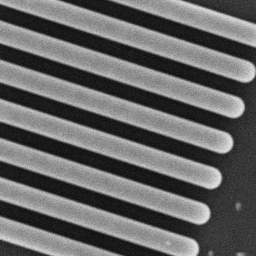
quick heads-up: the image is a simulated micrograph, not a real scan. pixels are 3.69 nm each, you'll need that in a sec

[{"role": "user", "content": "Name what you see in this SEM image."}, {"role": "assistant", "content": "groups of lines, slits or small figures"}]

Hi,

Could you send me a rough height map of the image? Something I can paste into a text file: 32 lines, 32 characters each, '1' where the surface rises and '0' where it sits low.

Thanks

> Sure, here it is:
11111111100000011111111100000000
00011111111100000011111111100000
00000011111111100000001111111100
11100000011111111100000001111111
11111100000001111111100000001111
01111111100000001111111100000001
00001111111100000001111111100000
00000001111111100000001111111100
11100000001111111100000001111111
11111100000001111111100000001111
01111111100000001111111100000000
00001111111100000001111111110000
00000001111111100000001111111100
11100000001111111110000001111100
11111110000001111111110000001100
01111111110000001111111110000000
00001111111110000001111111110000
10000001111111110000001111111000
11110000001111111110000000111000
11111110000001111111110000000000
01111111110000000111111110000000
00000111111110000000111111100000
10000000111111110000000111110000
11110000000111111110000000000000
11111110000000111111110000000000
00111111110000000111111110000000
00000111111110000000111111000000
10000000111111110000000111000000
11110000000111111111000000000000
11111111000000111111111000000000
00111111111000000111111110000000
00000111111111000000111110000000